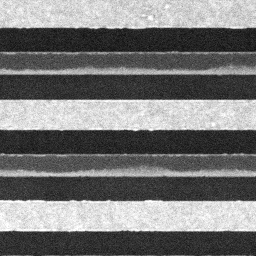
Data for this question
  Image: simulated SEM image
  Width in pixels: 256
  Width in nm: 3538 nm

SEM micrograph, lines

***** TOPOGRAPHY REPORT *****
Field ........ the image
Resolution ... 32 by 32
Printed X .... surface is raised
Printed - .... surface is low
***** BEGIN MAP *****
XXXXXXXXXXXXXXXXXXXXXXXXXXXXXXXX
XXXXXXXXXXXXXXXXXXXXXXXXXXXXXXXX
XXXXXXXXXXXXXXXXXXXXXXXXXXXXXXXX
--------------------------------
--------------------------------
--------------------------------
---------------------X----------
XXXXXXXXXXXXXXXXXXXXXXXXXXXXXXXX
XXXXXXXXXXXXXXXXXXXXXXXXXXXXXXXX
--------------------------------
--------------------------------
--------------------------------
--------------------------------
XXXXXXXXXXXXXXXXXXXXXXXXXXXXXXXX
XXXXXXXXXXXXXXXXXXXXXXXXXXXXXXXX
XXXXXXXXXXXXXXXXXXXXXXXXXXXXXXXX
--------------------------------
--------------------------------
--------------------------------
XXXXXXXXXXXXXXXXXXXXXXXXXXXXXXXX
XXXXXXXXXXXXXXXXXXXXXXXXXXXXXXXX
XXXXXXXXXXXXXXXXX--XXXXXXXXXXXXX
--------------------------------
--------------------------------
--------------------------------
XXXXXXXXXXXXXXXXXXXXXXXXXXXXXXXX
XXXXXXXXXXXXXXXXXXXXXXXXXXXXXXXX
XXXXXXXXXXXXXXXXXXXXXXXXXXXXXXXX
XXXXXXXXXXXXXXXXXXXXXXXXXXXXXXXX
--------------------------------
--------------------------------
--------------------------------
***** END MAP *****